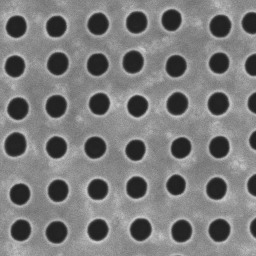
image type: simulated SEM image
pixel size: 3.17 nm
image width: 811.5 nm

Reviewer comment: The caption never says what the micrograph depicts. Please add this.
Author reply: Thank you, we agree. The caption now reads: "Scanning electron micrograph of a regular array of holes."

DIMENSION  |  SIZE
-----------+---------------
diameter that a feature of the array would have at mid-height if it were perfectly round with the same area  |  0.0638 micrometres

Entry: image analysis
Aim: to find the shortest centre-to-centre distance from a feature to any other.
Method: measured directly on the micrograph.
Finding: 120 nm